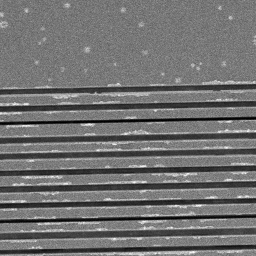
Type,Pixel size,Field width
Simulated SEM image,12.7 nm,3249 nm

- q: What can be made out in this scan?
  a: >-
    parallel lines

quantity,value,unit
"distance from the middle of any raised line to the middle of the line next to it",0.203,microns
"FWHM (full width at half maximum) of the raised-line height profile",125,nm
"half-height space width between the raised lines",87.2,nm